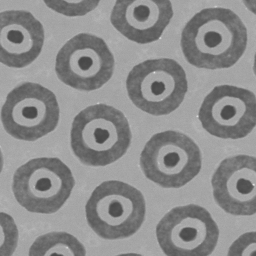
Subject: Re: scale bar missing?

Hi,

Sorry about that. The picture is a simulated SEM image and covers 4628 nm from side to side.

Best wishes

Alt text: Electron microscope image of a regular array of ring-shaped grooves with a dot in the middle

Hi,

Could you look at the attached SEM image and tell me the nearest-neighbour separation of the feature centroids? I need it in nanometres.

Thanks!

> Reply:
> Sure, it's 1330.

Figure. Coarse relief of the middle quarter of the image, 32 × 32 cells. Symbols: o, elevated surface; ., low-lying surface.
..oo...oo...oooooo...........ooo
..ooooooo...ooooo.............oo
...ooooo....oooo.....ooooo....oo
............oooo....ooooooo....o
...........ooooo....oo..oooo...o
o........ooooooo...ooo...ooo...o
oooooo..oooooooo...ooo...oo....o
oooooooooooooooo....oo..ooo...oo
ooooooooooooooooo...oooooo....oo
ooooooooooooooooo............ooo
ooooooo....ooooooo...........ooo
ooooo.........oooooo........oooo
ooo............ooooooo....oooooo
ooo.............oooooooooooooooo
oo.....ooooo....oooooooooooooooo
oo...oooooooo...oooooooooooooooo
oo...ooo...oo...oooooooooooooooo
oo...ooo...oo....oooooo.......oo
oo...ooo...oo....ooooo.........o
oo...ooo..ooo...ooooo...........
oo....oooooo....oooo.....ooo....
oo......oo......oooo....oooooo..
ooo............oooo....ooo..ooo.
oooo..........ooooo....oo....oo.
ooooo.......ooooooo....oo....oo.
.ooooooo.oooooooooo....oooo.oo..
..oooooooooooooooooo....ooooo...
..oooooooooooooooooo.....oo.....
..ooooooooooooooooooo...........
...ooooooo.....oooooooo........o
..oooooo.........ooooooo......oo
..oooooo...........ooooooooooooo